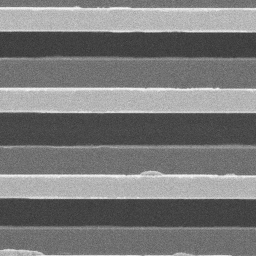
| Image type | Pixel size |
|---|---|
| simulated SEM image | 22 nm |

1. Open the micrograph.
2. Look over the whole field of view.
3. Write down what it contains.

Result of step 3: lines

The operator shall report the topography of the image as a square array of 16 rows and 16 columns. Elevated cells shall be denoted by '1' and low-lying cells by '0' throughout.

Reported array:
1111111111111111
1111111111111111
0000000000000000
0000000000000000
1111111111111111
1111111111111111
1111111111111111
0000000000000000
0000000000000000
1111111111111111
1111111111111111
1111111111111111
0000000000000000
0000000000000000
1111111111111111
1111111111111111